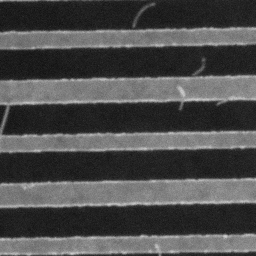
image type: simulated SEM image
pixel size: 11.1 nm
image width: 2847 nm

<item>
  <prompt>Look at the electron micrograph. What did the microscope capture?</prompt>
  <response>lines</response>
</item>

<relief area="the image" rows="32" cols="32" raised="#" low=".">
................................
................................
................................
................................
################################
###############################.
................................
................................
................................
................................
################################
################################
###########################.#...
................................
................................
................................
..........................#.####
################################
######################..........
................................
................................
................................
.......................#########
################################
################################
################................
................................
................................
................................
........................########
################################
######################..........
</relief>